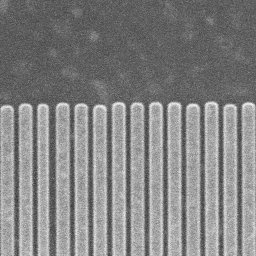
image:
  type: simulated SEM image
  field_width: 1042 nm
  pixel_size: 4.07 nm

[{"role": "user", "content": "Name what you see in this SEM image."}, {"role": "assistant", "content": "parallel lines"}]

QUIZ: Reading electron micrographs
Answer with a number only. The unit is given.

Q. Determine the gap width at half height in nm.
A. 25.4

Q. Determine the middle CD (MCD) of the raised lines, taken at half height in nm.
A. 47.8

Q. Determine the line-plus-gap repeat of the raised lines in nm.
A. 75.6